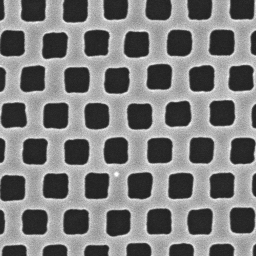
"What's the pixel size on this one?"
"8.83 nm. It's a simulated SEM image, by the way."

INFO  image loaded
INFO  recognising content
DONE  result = a regular array of holes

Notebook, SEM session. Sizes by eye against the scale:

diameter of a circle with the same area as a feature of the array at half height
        248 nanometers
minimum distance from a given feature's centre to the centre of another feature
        354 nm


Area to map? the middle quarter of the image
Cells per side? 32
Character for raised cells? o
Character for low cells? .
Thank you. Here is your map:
ooooooooooooooooooooo......ooooo
......ooooo.....ooooo......oooo.
.......ooo......ooooo......oooo.
.......ooo......ooooo......oooo.
.......ooo......ooooo......oooo.
......oooo......ooooo......oooo.
......oooo......oooooooo.ooooooo
ooooooooooo...oooooooooooooooooo
oooooooooooooooooooooooooooooooo
oooooooooooooooooooooooooo.....o
.oooo......ooooo......ooo.......
.oooo......ooooo......ooo.......
.oooo......ooooo......ooo.......
.oooo......ooooo......ooo.......
.oooo......ooooo......ooo.......
.oooo......ooooo......oooo.....o
oooooooo.oooooooo....ooooooooooo
oooooooooooooooooooooooooooooooo
oooooooooooo...ooooooo....oooooo
......oooo......ooooo......oooo.
......oooo......ooooo......oooo.
......oooo......ooooo......oooo.
......oooo......ooooo......oooo.
......oooo......ooooo......oooo.
......oooo......ooooo.....oooooo
oooooooooooooooooooooooooooooooo
oooooooooooooooooooooooooooooooo
.ooooo.....oooooo.....ooooo.....
.oooo......ooooo......oooo......
.oooo.......oooo......oooo......
.oooo......ooooo......oooo......
.oooo......ooooo......oooo......